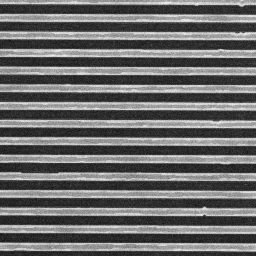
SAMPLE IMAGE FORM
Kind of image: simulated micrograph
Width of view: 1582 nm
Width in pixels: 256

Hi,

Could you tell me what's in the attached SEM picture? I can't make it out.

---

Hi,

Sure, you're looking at parallel lines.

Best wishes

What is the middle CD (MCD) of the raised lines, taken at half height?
44 nanometres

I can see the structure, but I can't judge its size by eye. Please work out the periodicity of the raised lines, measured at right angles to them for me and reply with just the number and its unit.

109 nanometers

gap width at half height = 60.2 nm